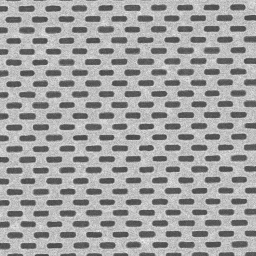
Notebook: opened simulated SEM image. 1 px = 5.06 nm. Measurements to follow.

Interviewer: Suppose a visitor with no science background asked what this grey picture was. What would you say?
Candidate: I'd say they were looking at a regular array of holes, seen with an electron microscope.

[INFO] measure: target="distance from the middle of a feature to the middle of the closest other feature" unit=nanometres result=84.4